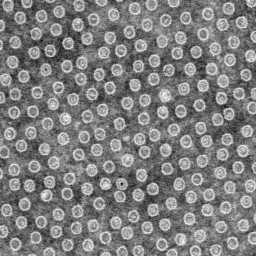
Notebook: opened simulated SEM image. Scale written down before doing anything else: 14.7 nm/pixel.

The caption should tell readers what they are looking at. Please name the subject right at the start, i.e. a regular array of raised bodies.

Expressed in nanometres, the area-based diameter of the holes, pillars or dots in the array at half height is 154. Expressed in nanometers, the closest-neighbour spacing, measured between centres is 258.